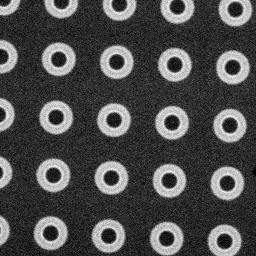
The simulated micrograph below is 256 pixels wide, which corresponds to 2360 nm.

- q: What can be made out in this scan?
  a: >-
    an array of small figures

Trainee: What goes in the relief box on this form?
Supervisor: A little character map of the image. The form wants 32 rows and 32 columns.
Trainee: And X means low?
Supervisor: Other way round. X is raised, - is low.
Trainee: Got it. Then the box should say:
XX----XXXX---XXXX---XXXX---XXXX-
XX----XXX----XXXX---XXXX---XXXX-
--------------X------XX-----XXX-
--------------------------------
--------------------------------
X------X------------------------
XX---XXXX----XXX-----XX-----XX--
XX---XXXX----XXXX---XXXX---XXXX-
XX----XXX----XXXX---XXXX---XXXX-
--------------XX----XXX----XXXX-
--------------------------------
--------------------------------
X-------------------------------
XX---XXXX----XXX-----X----------
XX---XXXX---XXXX----XXX----XXX--
X----XXXX---XXXX---XXXXX---XXXX-
------XX-----XXX----XXX----XXXX-
----------------------------XX--
--------------------------------
--------------------------------
X----XXX-----XX-----------------
X----XXXX---XXXX---XXXX----XXX--
X----XXXX---XXXX---XXXX---XXXX--
-----XXX----XXXX---XXXX---XXXX--
--------------------XX-----XXX--
--------------------------------
--------------------------------
X----XXX-----X------------------
X---XXXX----XXX----XXX-----XX---
X---XXXX----XXXX---XXXX---XXXX--
-----XXX----XXX----XXXX---XXXX--
-------------X------XX-----XXX--